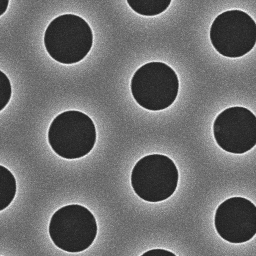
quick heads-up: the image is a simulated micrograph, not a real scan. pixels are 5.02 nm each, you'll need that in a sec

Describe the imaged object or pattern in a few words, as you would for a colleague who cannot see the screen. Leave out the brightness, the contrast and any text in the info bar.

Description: holes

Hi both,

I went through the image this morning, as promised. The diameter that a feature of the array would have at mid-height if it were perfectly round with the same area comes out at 244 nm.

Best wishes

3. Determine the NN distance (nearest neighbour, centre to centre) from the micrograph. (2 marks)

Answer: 467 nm